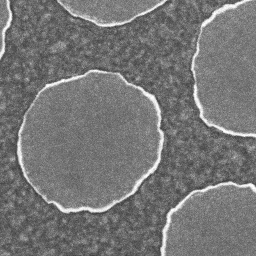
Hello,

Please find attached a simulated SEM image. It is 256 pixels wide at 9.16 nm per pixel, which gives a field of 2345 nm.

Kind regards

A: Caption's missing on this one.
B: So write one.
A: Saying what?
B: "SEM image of raised bodies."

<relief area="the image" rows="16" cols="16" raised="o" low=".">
o...oooooo....oo
o.....o......ooo
............oooo
............oooo
......o.....oooo
...oooooo...oooo
..oooooooo..oooo
.ooooooooo...ooo
.ooooooooo......
.ooooooooo......
.ooooooooo......
..ooooooo.......
...ooooo....oooo
...........ooooo
..........oooooo
..........oooooo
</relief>